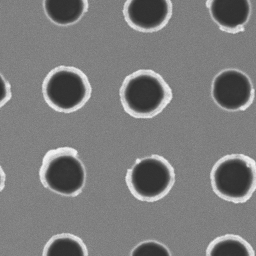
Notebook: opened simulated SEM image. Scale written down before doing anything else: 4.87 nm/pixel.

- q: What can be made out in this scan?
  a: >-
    holes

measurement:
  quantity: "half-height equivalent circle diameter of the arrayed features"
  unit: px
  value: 35.1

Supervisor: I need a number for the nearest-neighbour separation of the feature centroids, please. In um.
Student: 0.407